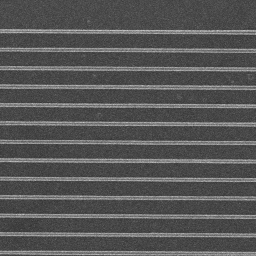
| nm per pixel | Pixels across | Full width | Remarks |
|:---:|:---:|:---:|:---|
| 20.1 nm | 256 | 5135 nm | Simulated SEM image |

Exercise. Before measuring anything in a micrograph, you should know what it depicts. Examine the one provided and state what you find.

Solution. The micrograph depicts parallel lines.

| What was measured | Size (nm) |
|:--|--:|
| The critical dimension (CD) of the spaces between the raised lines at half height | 311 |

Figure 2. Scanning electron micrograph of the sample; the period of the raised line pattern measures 370 nm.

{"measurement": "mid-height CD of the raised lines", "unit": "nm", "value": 52.7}